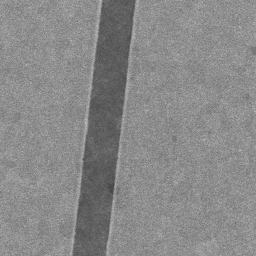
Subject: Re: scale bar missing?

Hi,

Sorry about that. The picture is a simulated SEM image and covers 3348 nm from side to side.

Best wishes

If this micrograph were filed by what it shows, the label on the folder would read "one or a few lines or trenches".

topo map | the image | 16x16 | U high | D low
UUUUUUDDUUUUUUUU
UUUUUUDDUUUUUUUU
UUUUUUDDUUUUUUUU
UUUUUUDDUUUUUUUU
UUUUUUDDUUUUUUUU
UUUUUUDDUUUUUUUU
UUUUUUDDUUUUUUUU
UUUUUDDDUUUUUUUU
UUUUUDDDUUUUUUUU
UUUUUDDUUUUUUUUU
UUUUUDDUUUUUUUUU
UUUUUDDUUUUUUUUU
UUUUUDDUUUUUUUUU
UUUUUDDUUUUUUUUU
UUUUUDDUUUUUUUUU
UUUUUDDUUUUUUUUU